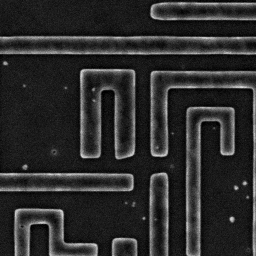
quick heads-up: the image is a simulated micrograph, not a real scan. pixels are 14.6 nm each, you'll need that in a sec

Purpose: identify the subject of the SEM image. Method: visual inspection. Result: wiring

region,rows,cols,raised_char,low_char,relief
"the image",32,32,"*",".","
...................*************
...................*************
................................
................................
................................
********************************
********************************
................................
................................
..........*******..*************
..........*******..*************
..........***.***..**...........
..........***.***..**...........
..........***.***..**...*****...
..........***.***..**..******...
..........***.***..**..**...*...
..........***.***..**..**...*...
..........***.***..**..**...*...
..........***.***..**..**...*...
..........**...*.......**.......
.......................**.......
.......................**.......
*****************..**..**.......
****************...**..**.......
...................**..**.......
...................**..**.......
..******...........**..**.......
..******...........**..**.......
..**..**...........**..**.......
..**..**...........**..**.......
..**..***.....***..**..**.......
..**..******..***..**..**.......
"